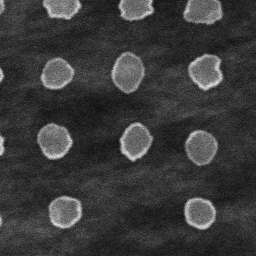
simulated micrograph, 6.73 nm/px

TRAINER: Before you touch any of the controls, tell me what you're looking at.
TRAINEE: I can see a regular array of raised bodies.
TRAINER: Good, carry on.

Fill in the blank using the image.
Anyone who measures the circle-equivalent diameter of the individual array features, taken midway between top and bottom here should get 216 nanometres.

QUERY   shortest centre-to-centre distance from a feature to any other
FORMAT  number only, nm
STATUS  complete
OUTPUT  450